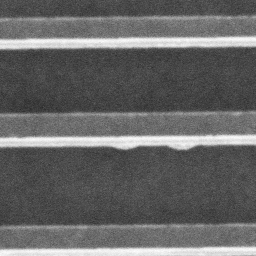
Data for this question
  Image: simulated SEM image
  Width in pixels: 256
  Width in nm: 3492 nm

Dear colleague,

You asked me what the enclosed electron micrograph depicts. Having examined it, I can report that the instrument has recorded lines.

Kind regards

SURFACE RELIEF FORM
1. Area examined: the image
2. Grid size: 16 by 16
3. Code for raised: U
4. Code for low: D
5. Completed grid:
DDDDDDDDDDDDDDDD
UUUUUUUUUUUUUUUU
UUUUUUUUUUUUUUUU
DDDDDDDDDDDDDDDD
DDDDDDDDDDDDDDDD
DDDDDDDDDDDDDDDD
DDDDDDDDDDDDDDDD
UUUUUUUUUUUUUUUU
UUUUUUUUUUUUUUUU
DDDDDDDDDDDDDDDD
DDDDDDDDDDDDDDDD
DDDDDDDDDDDDDDDD
DDDDDDDDDDDDDDDD
DDDDDDDDDDDDDDDD
UUUUUUUUUUUUUUUU
UUUUUUUUUUUUUUUU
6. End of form